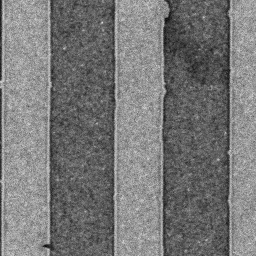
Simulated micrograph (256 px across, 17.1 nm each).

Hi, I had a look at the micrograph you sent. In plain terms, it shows one or a few lines or trenches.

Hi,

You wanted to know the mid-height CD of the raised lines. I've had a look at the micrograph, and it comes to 785 nanometers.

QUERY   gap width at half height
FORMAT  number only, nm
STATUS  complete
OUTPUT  1160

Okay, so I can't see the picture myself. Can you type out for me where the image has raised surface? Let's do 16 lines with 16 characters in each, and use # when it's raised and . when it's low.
###....###....##
###....###....##
###....###....##
###....###....##
###....###....##
###....###....##
###....###....##
###....###....##
###....###....##
###....###....##
###....###....##
###....###....##
###....###....##
###....###....##
###....###....##
###....###....##